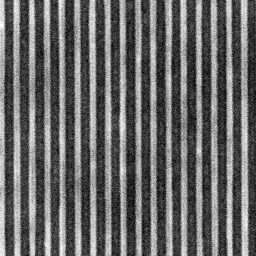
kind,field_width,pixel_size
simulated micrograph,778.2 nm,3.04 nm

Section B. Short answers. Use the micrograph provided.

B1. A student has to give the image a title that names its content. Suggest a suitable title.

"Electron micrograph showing parallel lines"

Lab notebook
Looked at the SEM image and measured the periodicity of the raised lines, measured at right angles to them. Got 46.2 nanometers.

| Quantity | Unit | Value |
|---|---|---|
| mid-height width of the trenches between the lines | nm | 32.7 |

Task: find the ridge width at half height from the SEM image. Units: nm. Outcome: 14.8